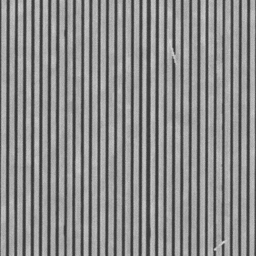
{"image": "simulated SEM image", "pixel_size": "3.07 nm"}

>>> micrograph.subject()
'parallel lines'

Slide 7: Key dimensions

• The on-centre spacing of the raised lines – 25.4 nanometers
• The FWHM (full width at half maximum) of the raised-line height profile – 14.9 nm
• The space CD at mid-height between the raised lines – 0.0088 microns